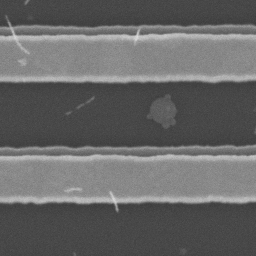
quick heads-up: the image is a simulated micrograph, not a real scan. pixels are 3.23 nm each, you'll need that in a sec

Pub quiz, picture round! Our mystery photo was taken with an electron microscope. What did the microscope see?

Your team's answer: lines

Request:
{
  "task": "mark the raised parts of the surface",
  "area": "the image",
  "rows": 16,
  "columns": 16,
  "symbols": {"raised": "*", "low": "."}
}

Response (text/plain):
................
................
****************
****************
****************
................
................
................
................
****************
****************
****************
****************
................
................
................